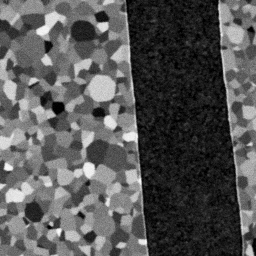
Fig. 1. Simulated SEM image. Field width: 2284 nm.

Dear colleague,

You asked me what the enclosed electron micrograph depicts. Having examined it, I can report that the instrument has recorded one or a few lines or trenches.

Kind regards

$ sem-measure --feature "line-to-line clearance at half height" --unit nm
831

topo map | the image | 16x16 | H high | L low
HHHHHHHHLLLLLLHH
HHHHHHHHLLLLLLHH
HHHHHHHHLLLLLLHH
HHHHHHHHLLLLLLHH
HHHHHHHHLLLLLLHH
HHHHHHHHLLLLLLHH
HHHHHHHHLLLLLLHH
HHHHHHHHLLLLLLHH
HHHHHHHHHLLLLLHH
HHHHHHHHHLLLLLLH
HHHHHHHHHLLLLLLH
HHHHHHHHHLLLLLLH
HHHHHHHHHLLLLLLH
HHHHHHHHHLLLLLLH
HHHHHHHHHLLLLLLH
HHHHHHHHHLLLLLLH